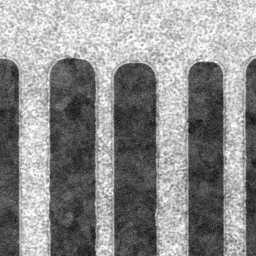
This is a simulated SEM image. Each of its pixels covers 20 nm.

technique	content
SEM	one or a few lines or trenches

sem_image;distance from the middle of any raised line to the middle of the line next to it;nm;1330